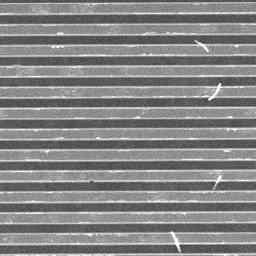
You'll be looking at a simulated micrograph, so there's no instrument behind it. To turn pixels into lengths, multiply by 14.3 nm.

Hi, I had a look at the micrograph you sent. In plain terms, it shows parallel lines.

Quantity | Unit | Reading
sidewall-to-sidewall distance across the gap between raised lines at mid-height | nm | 140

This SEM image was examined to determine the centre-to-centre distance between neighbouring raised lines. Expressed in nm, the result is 300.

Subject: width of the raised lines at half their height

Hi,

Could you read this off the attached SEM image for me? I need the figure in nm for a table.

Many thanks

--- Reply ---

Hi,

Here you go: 152